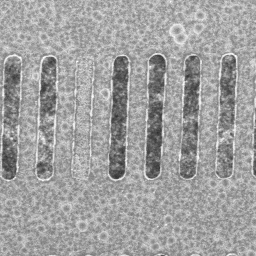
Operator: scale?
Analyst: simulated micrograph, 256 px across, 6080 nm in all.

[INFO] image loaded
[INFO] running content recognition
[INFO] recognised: holes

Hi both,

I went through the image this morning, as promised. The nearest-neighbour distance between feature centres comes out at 855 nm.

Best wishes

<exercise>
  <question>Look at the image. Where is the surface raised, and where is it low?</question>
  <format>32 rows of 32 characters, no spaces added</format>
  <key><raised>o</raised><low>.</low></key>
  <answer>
oooooooooooooooooooooooooooooooo
oooooooooooooooooooooooooooooooo
oooooooooooooooooooooooooooooooo
oooooooooooooooooooooooooooooooo
oooooooooooooooooooooooooooooooo
oooooooooooooooooooooooooooooooo
oooooooooooooooooooooooooooooooo
o..oo..ooooooo..ooo..oo..ooo.ooo
o..oo..ooooooo..ooo..oo..ooo..oo
...oo..ooooooo..oo...oo..oo...oo
...oo..ooo.ooo..oo...oo..oo..ooo
...oo..oo...oo..oo...oo..oo...oo
...oo..oo...oo..oo...oo..oo...oo
...oo..oo..ooo..oo..ooo..oo...oo
..ooo..oo..ooo..oo..ooo..oo..ooo
..ooo..oo..ooo..oo..ooo..oo..ooo
..ooo..oo..ooo..oo..ooo..oo..ooo
..ooo..oo..ooo..oo..ooo..oo..ooo
..ooo..oo..ooo..oo..ooo..oo..ooo
..ooo..ooooooo..oo..ooo..oo..ooo
..ooo..ooooooo..oo..oo...oo..ooo
..ooo..ooooooo..oo..ooo.ooo..ooo
oooooooooooooooooooooooooooooooo
oooooooooooooooooooooooooooooooo
oooooooooooooooooooooooooooooooo
oooooooooooooooooooooooooooooooo
oooooooooooooooooooooooooooooooo
oooooooooooooooooooooooooooooooo
oooooooooooooooooooooooooooooooo
oooooooooooooooooooooooooooooooo
oooooooooooooooooooooooooooooooo
oooooooooooooooooooooooooooooooo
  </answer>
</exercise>